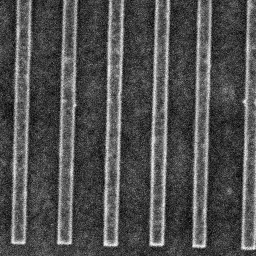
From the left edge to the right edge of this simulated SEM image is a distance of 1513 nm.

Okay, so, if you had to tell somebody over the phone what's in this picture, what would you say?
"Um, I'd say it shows parallel lines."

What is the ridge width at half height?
0.0761 microns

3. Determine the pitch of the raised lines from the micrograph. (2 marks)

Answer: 268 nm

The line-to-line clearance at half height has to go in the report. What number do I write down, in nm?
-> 199